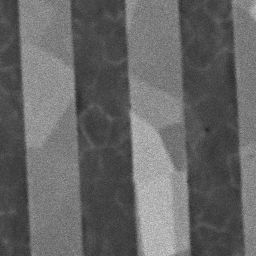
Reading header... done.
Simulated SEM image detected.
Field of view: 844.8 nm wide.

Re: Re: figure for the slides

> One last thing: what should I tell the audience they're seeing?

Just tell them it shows one or a few lines or trenches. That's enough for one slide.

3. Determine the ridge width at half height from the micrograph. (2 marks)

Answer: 168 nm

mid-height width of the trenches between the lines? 184 nm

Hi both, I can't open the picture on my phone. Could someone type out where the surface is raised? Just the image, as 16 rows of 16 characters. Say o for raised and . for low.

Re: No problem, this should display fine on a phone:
.ooo....ooo....o
.ooo....ooo....o
.ooo....ooo....o
.oooo...ooo....o
.oooo...ooo....o
.oooo...ooo....o
..ooo...ooo....o
..ooo...ooo....o
..ooo...oooo...o
..ooo...oooo...o
..ooo...oooo...o
..ooo...oooo...o
..ooo....ooo...o
..ooo....ooo...o
..ooo....ooo...o
..ooo....ooo...o